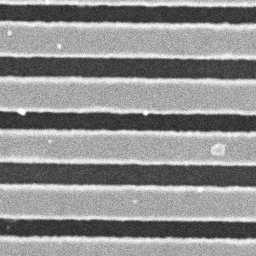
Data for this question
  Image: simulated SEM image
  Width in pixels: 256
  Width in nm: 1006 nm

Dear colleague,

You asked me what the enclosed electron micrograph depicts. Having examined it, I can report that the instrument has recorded lines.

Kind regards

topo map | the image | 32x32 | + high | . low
++++++++++++++++++++++++++++++++
................................
................................
++++++++++++++++++++++++++++++++
++++++++++++++++++++++++++++++++
++++++++++++++++++++++++++++++++
++++++++++++++++++++++++++++++++
................................
................................
................................
++++++++++++++++++++++++++++++++
++++++++++++++++++++++++++++++++
++++++++++++++++++++++++++++++++
++++++++++++++++++++++++++++++++
................................
................................
++++++++++++++++++++++.++..+...+
++++++++++++++++++++++++++++++++
++++++++++++++++++++++++++++++++
++++++++++++++++++++++++++++++++
.................+++++++++++++++
................................
................................
++++++++++++++++++++++++++++++++
++++++++++++++++++++++++++++++++
++++++++++++++++++++++++++++++++
++++++++++++++++++++++++++++++++
...............+.+++++++++++++++
................................
................................
++++++++++++++++++++++++++++++++
++++++++++++++++++++++++++++++++